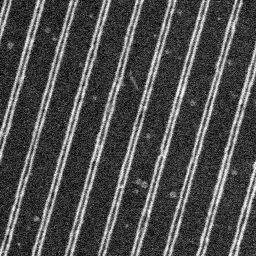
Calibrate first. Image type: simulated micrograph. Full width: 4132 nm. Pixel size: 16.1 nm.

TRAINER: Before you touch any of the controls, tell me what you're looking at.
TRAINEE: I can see parallel lines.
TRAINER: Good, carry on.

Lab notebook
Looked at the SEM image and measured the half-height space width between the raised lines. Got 429 nm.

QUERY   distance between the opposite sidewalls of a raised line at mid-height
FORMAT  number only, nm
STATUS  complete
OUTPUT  83.5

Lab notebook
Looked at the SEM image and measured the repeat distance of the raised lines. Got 512 nm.